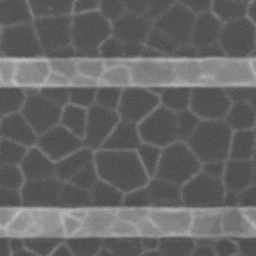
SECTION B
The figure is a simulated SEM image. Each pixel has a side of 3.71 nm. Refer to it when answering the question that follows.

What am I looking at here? one or a few lines or trenches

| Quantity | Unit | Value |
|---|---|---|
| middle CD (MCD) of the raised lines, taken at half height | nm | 108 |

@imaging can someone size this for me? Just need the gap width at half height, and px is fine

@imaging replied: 121